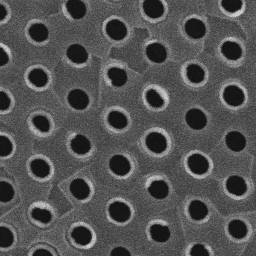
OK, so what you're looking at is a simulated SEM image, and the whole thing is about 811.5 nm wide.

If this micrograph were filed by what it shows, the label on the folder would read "a regular array of holes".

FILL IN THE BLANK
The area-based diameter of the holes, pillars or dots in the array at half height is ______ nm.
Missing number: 63.2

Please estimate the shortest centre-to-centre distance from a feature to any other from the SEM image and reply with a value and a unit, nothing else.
0.14 microns